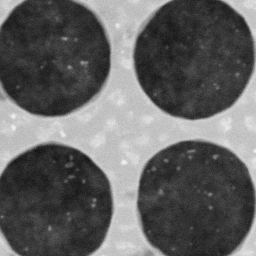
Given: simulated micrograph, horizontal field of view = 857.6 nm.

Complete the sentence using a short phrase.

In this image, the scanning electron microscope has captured holes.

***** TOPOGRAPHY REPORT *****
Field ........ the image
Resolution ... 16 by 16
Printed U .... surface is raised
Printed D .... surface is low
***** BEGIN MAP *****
UDDDDDUUUUDDDDDU
DDDDDDUUUDDDDDDU
DDDDDDDUUDDDDDDD
DDDDDDDUDDDDDDDD
DDDDDDDUDDDDDDDD
DDDDDDUUUDDDDDDU
UDDDDUUUUUDDDDDU
UUUUUUUUUUUUUUUU
UUUUUUUUUUUUUUUU
UDDDDUUUUUDDDDUU
DDDDDDUUUDDDDDDU
DDDDDDDUUDDDDDDD
DDDDDDDUUDDDDDDD
DDDDDDDUUDDDDDDD
DDDDDDDUUDDDDDDD
UDDDDDUUUUDDDDDU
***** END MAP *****